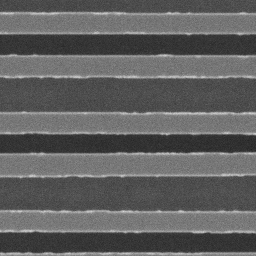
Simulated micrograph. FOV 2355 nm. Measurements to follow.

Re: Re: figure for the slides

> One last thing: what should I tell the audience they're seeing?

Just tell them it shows lines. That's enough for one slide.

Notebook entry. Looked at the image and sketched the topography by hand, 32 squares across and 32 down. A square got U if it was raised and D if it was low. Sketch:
DDDDDDDDDDDDDDDDDDDDDDDDDDDDDDDD
DDDDDDDDDDDDDDDDDDDDDDDDDDDDDDDD
UUUUUUUUUUUUUUUUUUUUUUUUUUUUUUUU
UUUUUUUUUUUUUUUUUUUUUUUUUUUUUUUU
DDDDDDDDDDDDDDDDDDDDDDDDDDDDDDDD
DDDDDDDDDDDDDDDDDDDDDDDDDDDDDDDD
DDDDDDDDDDDDDDDDDDDDDDDDDDDDDDDD
UUUUUUUUUUUUUUUUUUUUUUUUUUUUUUUU
UUUUUUUUUUUUUUUUUUUUUUUUUUUUUUUU
UUUUUUUUUUUUUUUUUUUUUUUUUUUUUUUU
DDDDDDDDDDDDDDDDDDDDDDDDDDDDDDDD
DDDDDDDDDDDDDDDDDDDDDDDDDDDDDDDD
DDDDDDDDDDDDDDDDDDDDDDDDDDDDDDDD
DDDDDDDDDDDDDDDDDDDDDDDDDDDDDDDD
UUUUUUUUUUUUUUUUUUUUUUUUUUUUUUUU
UUUUUUUUUUUUUUUUUUUUUUUUUUUUUUUU
UUUUUUUUUUUUUUUUUUUUUUUUUUUUUUUU
DDDDDDDDDDDDDDDDDDDDDDDDDDDDDDDD
DDDDDDDDDDDDDDDDDDDDDDDDDDDDDDDD
UUUUUUUUUUUUUUUUUUUUUUUUUUUUUUUU
UUUUUUUUUUUUUUUUUUUUUUUUUUUUUUUU
UUUUUUUUUUUUUUUUUUUUUUUUUUUUUUUU
DDDDDDDDDDDDDDDDDDDDDDDDDDDDDDDD
DDDDDDDDDDDDDDDDDDDDDDDDDDDDDDDD
DDDDDDDDDDDDDDDDDDDDDDDDDDDDDDDD
DDDDDDDDDDDDDDDDDDDDDDDDDDDDDDDD
UUUUUUUUUDUUUUDUUUDUDDUDUDDUDUDD
UUUUUUUUUUUUUUUUUUUUUUUUUUUUUUUU
UUUUUUUUUUUUUUUUUUUUUUUUUUUUUUUU
DDDDDDDDDDDDDDDDDDDDDDDDDDDDDDDD
DDDDDDDDDDDDDDDDDDDDDDDDDDDDDDDD
DDDDDDDDDDDDDDDDDDDDDDDDDDDDDDDD